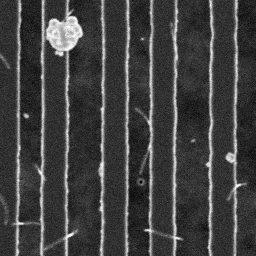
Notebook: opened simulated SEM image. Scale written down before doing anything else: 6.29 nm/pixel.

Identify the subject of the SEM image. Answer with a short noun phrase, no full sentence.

lines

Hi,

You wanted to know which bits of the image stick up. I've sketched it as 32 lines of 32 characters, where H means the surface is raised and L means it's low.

HHLLLHHHLLLLLHHHLLLHHHLLLLHHHHLL
HHLLLHHHHLLLLHHHLLLHHHLLLLHHHHLL
HHHLLHHHHHLLLHHHLLLHHHLLLLHHHHLL
HHLLLHHHHHLLLHHHLLLHHHLLLLHHHHLL
HHLLLHHHHHLLLHHHLLLHHHLLLLHHHHLL
HHLLLHHHHLLLLHHHLLLHHHLLLLHHHHLL
HHLLLHHHHLLLLHHHLLLHHHLLLLHHHHLL
HHLLLHHHLLLLLHHHLLLHHHLLLLHHHHLL
HHLLLHHHLLLLLHHHLLLHHHLLLLHHHHLL
HHLLLHHHLLLLLHHHLLLHHHLLLLHHHHLL
HHLLLHHHLLLLLHHHLLLHHHLLLLHHHHLL
HHLLLHHHLLLLLHHHLLLHHHLLLLHHHHLL
HHLLLHHHLLLLLHHHLLLHHHLLLLHHHHLL
HHLLLHHHLLLLLHHHLLLHHHLLLLHHHLLL
HHLLLHHHLLLLLHHHLLLHHHLLLLHHHHLL
HHLLLHHHLLLLLHHHLLLHHHLLLLHHHHLL
HHLLLHHHLLLLLHHHLLLHHHLLLLHHHLLL
HHLLLHHHLLLLLHHHLLLHHHLLLLHHHHLL
HHLLLHHHLLLLLHHHLLLHHHLLLLHHHHLL
HHLLLHHHLLLLLHHHLLLHHHLLLLHHHHLL
HHLLLHHHLLLLLHHHLLLHHHLLLLHHHLLL
HHLLLHHHLLLLLHHHLLLHHHLLLLHHHLLL
HHLLLHHHLLLLLHHHLLLHHHLLLLHHHHLL
HHLLLHHHLLLLLHHHLLLHHHLLLLHHHHLL
HHLLLHHHLLLLLHHHLLLHHHLLLLHHHHLL
HHLLLHHHLLLLLHHHLLLHHHLLLLHHHHLL
HHLLLHHHLLLLLHHHLLLHHHLLLLHHHHLL
HHLLLHHHLLLLLHHHLLLHHHLLLLHHHHLL
HHLLLHHHLLLLLHHHLLLHHHLLLLHHHHLL
HHLLLHHHHLLLLHHHLLLHHHLLLLHHHLLL
HHLLLHHHLLLLLHHHLLLHHHLLLLHHHLLL
HHLLLHHHLLLLLHHHLLLHHHLLLLHHHLLL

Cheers